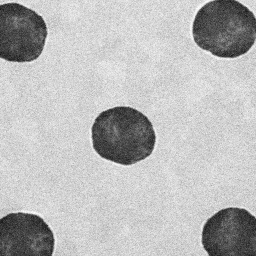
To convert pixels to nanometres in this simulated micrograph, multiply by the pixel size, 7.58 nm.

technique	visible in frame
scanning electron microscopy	holes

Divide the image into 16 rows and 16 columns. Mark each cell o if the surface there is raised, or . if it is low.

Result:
..oooooooooo....
...ooooooooo....
...ooooooooo....
..ooooooooooo..o
oooooooooooooooo
oooooooooooooooo
oooooooooooooooo
oooooo...ooooooo
oooooo....oooooo
oooooo....oooooo
oooooooooooooooo
oooooooooooooooo
oooooooooooooooo
..ooooooooooo...
...oooooooooo...
...oooooooooo...